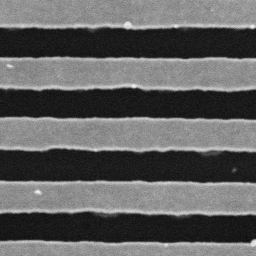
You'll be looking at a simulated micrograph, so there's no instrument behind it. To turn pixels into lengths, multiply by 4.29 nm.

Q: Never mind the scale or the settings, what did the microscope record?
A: lines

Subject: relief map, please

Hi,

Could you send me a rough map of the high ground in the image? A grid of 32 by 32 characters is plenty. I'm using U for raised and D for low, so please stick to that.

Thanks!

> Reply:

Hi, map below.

UUUUUUUUUUUUUUUUUUUUUUUUUUUUUUUU
UUUUUUUUUUUUUUUUUUUUUUUUUUUUUUUU
UUUUUUUUUUUUUUUUUUUUUUUUUUUUUUUU
DDUDDUUUUUDUDDDUUUUUUDDDDDDDDUUU
DDDDDDDDDDDDDDDDDDDDDDDDDDDDDDDD
DDDDDDDDDDDDDDDDDDDDDDDDDDDDDDDD
DDDDDDDDDDDDDDDDDDDDDDDDDDDDDDDD
UUUUUUUUUUUUUUUUUUUUUUUUUUUUUUUU
UUUUUUUUUUUUUUUUUUUUUUUUUUUUUUUU
UUUUUUUUUUUUUUUUUUUUUUUUUUUUUUUU
UUUUUUUUUUUUUUUUUUUUUUUUUUUUUUUU
DDDDDDDDDDDDDDDDDDDDDDDDDDDDDDDD
DDDDDDDDDDDDDDDDDDDDDDDDDDDDDDDD
DDDDDDDDDDDDDDDDDDDDDDDDDDDDDDDD
DDDDDDDDDDDDDDDDDDDDDDDDDDDDDDDD
UUUUUUUUUUUUUUUUUUUUUUUUUUUUUUUU
UUUUUUUUUUUUUUUUUUUUUUUUUUUUUUUU
UUUUUUUUUUUUUUUUUUUUUUUUUUUUUUUU
UUUUUUUUUUUUUUUUUUUUUUUUUUUUUUUU
DDDDDDDDDDDDDDDDDDDDDDDDDDDDDDDD
DDDDDDDDDDDDDDDDDDDDDDDDDDDDDDDD
DDDDDDDDDDDDDDDDDDDDDDDDDDDDDDDD
DDDDDDDDDDDDDDDDDDDDDDDDDDDDDDDD
UUUUUUUUUUUUUUUUUUUUUUUUUUUUUUUU
UUUUUUUUUUUUUUUUUUUUUUUUUUUUUUUU
UUUUUUUUUUUUUUUUUUUUUUUUUUUUUUUU
UUUUUUUUUUUDUUUUUUUUUUUUUUUUUUUU
DDDDDDDDDDDDDDDDDDDDDDDDDDDDDDDD
DDDDDDDDDDDDDDDDDDDDDDDDDDDDDDDD
DDDDDDDDDDDDDDDDDDDDDDDDDDDDDDDD
UUUUUUUUUUUUUUUUUUUUUUUUUUUUUUUU
UUUUUUUUUUUUUUUUUUUUUUUUUUUUUUUU